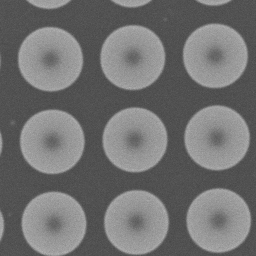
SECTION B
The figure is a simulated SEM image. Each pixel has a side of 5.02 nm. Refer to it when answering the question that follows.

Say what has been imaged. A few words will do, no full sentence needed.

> an array of small figures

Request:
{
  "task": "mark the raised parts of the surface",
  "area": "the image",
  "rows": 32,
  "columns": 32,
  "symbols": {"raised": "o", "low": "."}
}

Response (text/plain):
....oooo.......ooo.......ooo....
................................
................................
.....oo........ooo.......oooo...
...oooooo.....oooooo....oooooo..
...ooooooo...ooooooo...oooooooo.
..oooooooo...oooooooo..oooooooo.
..oooooooo...oooooooo..oooooooo.
..oooooooo...ooooooo...oooooooo.
...ooooooo...ooooooo....oooooo..
....ooooo.....ooooo......oooo...
................................
................................
..........................ooo...
....ooooo.....oooooo....oooooo..
...ooooooo...ooooooo....ooooooo.
...ooooooo...oooooooo..oooooooo.
...oooooooo..oooooooo..oooooooo.
...ooooooo...oooooooo..oooooooo.
...ooooooo...ooooooo....oooooo..
....ooooo.....ooooo......ooooo..
.....ooo........................
................................
................................
.....oooo......oooo......ooooo..
....oooooo....oooooo....ooooooo.
...ooooooo...oooooooo...ooooooo.
...oooooooo..oooooooo..oooooooo.
...oooooooo..oooooooo..oooooooo.
...ooooooo...oooooooo...ooooooo.
....oooooo....oooooo.....ooooo..
.....oooo.......ooo........o....